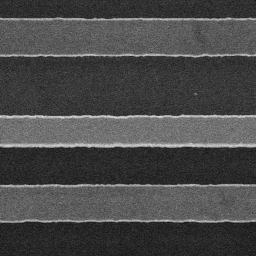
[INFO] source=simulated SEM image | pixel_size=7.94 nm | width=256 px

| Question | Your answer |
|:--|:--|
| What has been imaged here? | lines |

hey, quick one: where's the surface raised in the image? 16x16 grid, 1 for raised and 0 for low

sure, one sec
0000000000000000
1111111111111111
1111111111111111
1111100110111100
0000000000000000
0000000000000000
0000000000000000
1111111111111111
1111111111111111
0000000000000000
0000000000000000
0000000000000000
1111111111111111
1111111111111111
0000000000000000
0000000000000000